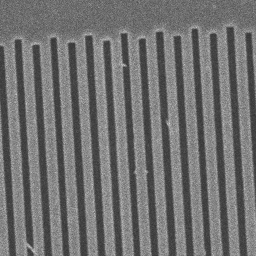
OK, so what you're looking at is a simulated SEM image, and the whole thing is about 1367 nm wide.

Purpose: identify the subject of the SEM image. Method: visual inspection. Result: parallel lines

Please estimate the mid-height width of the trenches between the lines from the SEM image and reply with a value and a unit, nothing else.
0.0413 um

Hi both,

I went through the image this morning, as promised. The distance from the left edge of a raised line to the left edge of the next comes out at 94.7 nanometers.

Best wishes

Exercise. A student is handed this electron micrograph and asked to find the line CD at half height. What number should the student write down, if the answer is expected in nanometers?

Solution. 56.6